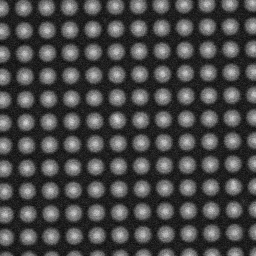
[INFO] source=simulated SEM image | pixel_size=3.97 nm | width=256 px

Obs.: an array of small figures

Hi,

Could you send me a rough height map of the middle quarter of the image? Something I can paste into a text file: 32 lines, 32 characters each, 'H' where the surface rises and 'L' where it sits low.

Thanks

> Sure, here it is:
LLLLLLLLLLLLLLLLLLLLLLLLLLLLLLHL
HHHLLLHHHLLLHHHLLHHHHLLHHHLLLHHH
HHHHLLHHHLLHHHHLLHHHHLLHHHHLHHHH
HHHHLLHHHLLHHHHLLHHHHLLHHHLLLHHH
HHHLLLHHHLLLHHLLLLHHLLLLHLLLLLLL
LLLLLLLLLLLLLLLLLLLLLLLLLLLLLLLL
LLLLLLLLLLLLLHLLLLHHLLLLHHLLLHHH
HHHLLLHHHLLHHHHLLHHHHLLHHHHLLHHH
HHHHLLHHHLLHHHHLLHHHHLLHHHHLLHHH
HHHHLLHHHLLLHHHLLHHHHLLHHHLLLHHH
LHHLLLLLLLLLLLLLLLLLLLLLLLLLLLLL
LLLLLLLLLLLLLLLLLLLLLLLLLLLLLLLL
LHHLLLLHHLLLHHHLLLHHLLLHHHLLLHHH
HHHHLLHHHLLHHHHLLHHHHLLHHHHLLHHH
HHHHLLHHHHLHHHHLLHHHHLLHHHHLLHHH
HHHHLLHHHLLLHHHLLLHHLLLLHHLLLHHH
LLLLLLLLLLLLLLLLLLLLLLLLLLLLLLLL
LLLLLLLLLLLLLLLLLLLLLLLLLLLLLLLL
LHHLLLHHHLLLHHHLLLHHHLLHHHHLLHHH
HHHHLLHHHHLLHHHLLHHHHLLHHHHLLHHH
HHHHLLHHHHLLHHHLLHHHHLLHHHHLLHHH
LHHLLLHHHLLLHHHLLLHHLLLLHHLLLLLL
LLLLLLLLLLLLLLLLLLLLLLLLLLLLLLLL
LLLLLLLLLLLLLLLLLLLLLLLLHHLLLLHH
LHHHLLHHHLLLHHHLLLHHHLLHHHHLLHHH
HHHHLLHHHHLLHHHHLHHHHLLHHHHLLHHH
HHHHLLHHHHLLHHHLLLHHHLLHHHHLLHHH
LHHLLLLHHLLLLHLLLLLLLLLLLLLLLLLL
LLLLLLLLLLLLLLLLLLLLLLLLLLLLLLLL
LLLLLLLLLLLLLHHLLLLHHLLLHHLLLLHH
LHHHLLHHHHLLHHHHLLHHHLLHHHHLLHHH
HHHHLLHHHHLLHHHHLLHHHLLHHHHLLHHH